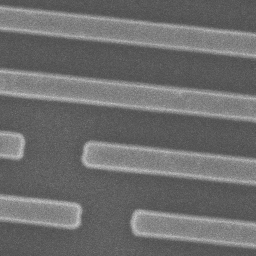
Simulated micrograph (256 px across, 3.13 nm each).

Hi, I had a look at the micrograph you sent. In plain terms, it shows parallel lines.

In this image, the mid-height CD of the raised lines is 0.0743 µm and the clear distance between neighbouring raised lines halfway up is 124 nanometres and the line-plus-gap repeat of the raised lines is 197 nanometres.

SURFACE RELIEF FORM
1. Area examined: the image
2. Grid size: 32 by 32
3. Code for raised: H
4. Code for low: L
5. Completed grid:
LLLLLLLLLLLLLLLLLLLLLLLLLLLLLLLL
HHHHHHLLLLLLLLLLLLLLLLLLLLLLLLLL
HHHHHHHHHHHHHHHHLLLLLLLLLLLLLLLL
HHHHHHHHHHHHHHHHHHHHHHHHHLLLLLLL
LLLLLLLLHHHHHHHHHHHHHHHHHHHHHHHH
LLLLLLLLLLLLLLLLLHHHHHHHHHHHHHHH
LLLLLLLLLLLLLLLLLLLLLLLLLLHHHHHH
LLLLLLLLLLLLLLLLLLLLLLLLLLLLLLLL
LLLLLLLLLLLLLLLLLLLLLLLLLLLLLLLL
HHHHHHHLLLLLLLLLLLLLLLLLLLLLLLLL
HHHHHHHHHHHHHHHHHLLLLLLLLLLLLLLL
HHHHHHHHHHHHHHHHHHHHHHHHHHLLLLLL
LLLLLLLLHHHHHHHHHHHHHHHHHHHHHHHH
LLLLLLLLLLLLLLLLLHHHHHHHHHHHHHHH
LLLLLLLLLLLLLLLLLLLLLLLLLLHHHHHH
LLLLLLLLLLLLLLLLLLLLLLLLLLLLLLLL
LLLLLLLLLLLLLLLLLLLLLLLLLLLLLLLL
HHHLLLLLLLLLLLLLLLLLLLLLLLLLLLLL
HHHLLLLLLLLHHHHHHHLLLLLLLLLLLLLL
HHLLLLLLLLHHHHHHHHHHHHHHHHHLLLLL
LLLLLLLLLLLHHHHHHHHHHHHHHHHHHHHH
LLLLLLLLLLLLLLLLLLHHHHHHHHHHHHHH
LLLLLLLLLLLLLLLLLLLLLLLLLLLHHHHH
LLLLLLLLLLLLLLLLLLLLLLLLLLLLLLLL
LLLLLLLLLLLLLLLLLLLLLLLLLLLLLLLL
HHHHHHHHHLLLLLLLLLLLLLLLLLLLLLLL
HHHHHHHHHHLLLLLLLHLLLLLLLLLLLLLL
HHHHHHHHHHLLLLLLLHHHHHHHHHHHLLLL
LLLLLLLLLLLLLLLLLHHHHHHHHHHHHHHH
LLLLLLLLLLLLLLLLLLLHHHHHHHHHHHHH
LLLLLLLLLLLLLLLLLLLLLLLLLLLLHHHH
LLLLLLLLLLLLLLLLLLLLLLLLLLLLLLLL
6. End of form